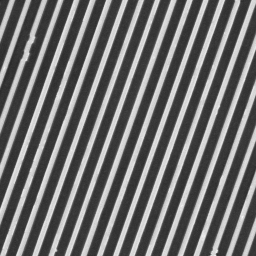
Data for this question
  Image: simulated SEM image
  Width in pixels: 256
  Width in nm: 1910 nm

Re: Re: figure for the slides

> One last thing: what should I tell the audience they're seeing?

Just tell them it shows parallel lines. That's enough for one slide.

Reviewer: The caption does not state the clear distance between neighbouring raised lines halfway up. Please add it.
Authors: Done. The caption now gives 70.4 nm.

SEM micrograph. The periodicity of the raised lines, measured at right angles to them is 113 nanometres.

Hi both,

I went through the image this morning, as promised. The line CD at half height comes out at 42.2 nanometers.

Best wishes